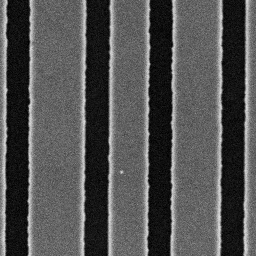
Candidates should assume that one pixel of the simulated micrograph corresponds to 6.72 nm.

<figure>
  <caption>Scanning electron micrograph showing lines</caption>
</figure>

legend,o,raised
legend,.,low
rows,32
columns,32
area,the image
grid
o...ooooooo...ooooo...oooooo...o
o...ooooooo...ooooo...oooooo...o
o...ooooooo...ooooo...oooooo...o
o...ooooooo...ooooo...oooooo...o
o...ooooooo...ooooo...oooooo...o
o...ooooooo...ooooo...oooooo...o
o...ooooooo...ooooo...oooooo...o
o...ooooooo...ooooo...oooooo...o
o...ooooooo...ooooo...oooooo...o
o...ooooooo...ooooo...oooooo...o
o...ooooooo...ooooo...oooooo...o
o...ooooooo...oooo....oooooo...o
o...ooooooo...ooooo...oooooo...o
o...ooooooo...ooooo...oooooo...o
o...ooooooo...oooo....oooooo...o
o...ooooooo...oooo...ooooooo...o
o...ooooooo...ooooo...oooooo...o
o...ooooooo...oooo....oooooo...o
o...ooooooo...oooo....oooooo...o
o...ooooooo...oooo....oooooo...o
o...ooooooo...ooooo...oooooo...o
o...ooooooo...oooo...ooooooo...o
o...ooooooo...oooo....oooooo...o
o...ooooooo...ooooo...oooooo...o
o...ooooooo...oooo...ooooooo...o
o...ooooooo...oooo...ooooooo...o
o...ooooooo...oooo...ooooooo...o
o...ooooooo...oooo....oooooo...o
o...ooooooo...oooo....oooooo...o
o...oooooo....oooo...ooooooo...o
o...ooooooo...oooo...ooooooo...o
o...oooooo....oooo...ooooooo...o